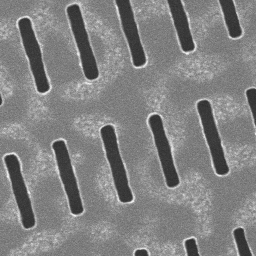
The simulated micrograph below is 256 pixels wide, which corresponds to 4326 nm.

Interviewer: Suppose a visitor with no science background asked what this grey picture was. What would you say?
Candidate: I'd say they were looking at holes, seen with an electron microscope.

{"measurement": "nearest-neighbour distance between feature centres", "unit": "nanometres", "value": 846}